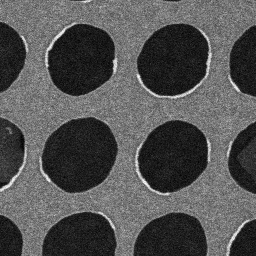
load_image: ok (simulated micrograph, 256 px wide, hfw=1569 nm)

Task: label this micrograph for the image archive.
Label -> holes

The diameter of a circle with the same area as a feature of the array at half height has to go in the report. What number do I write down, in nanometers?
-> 437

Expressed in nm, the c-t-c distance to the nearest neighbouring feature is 568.